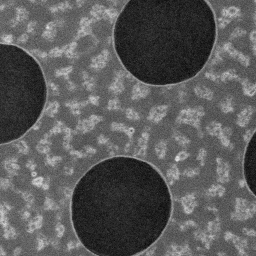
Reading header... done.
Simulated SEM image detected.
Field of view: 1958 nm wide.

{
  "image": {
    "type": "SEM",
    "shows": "holes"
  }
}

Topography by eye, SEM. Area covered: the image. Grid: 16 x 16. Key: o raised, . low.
oooooooo.....ooo
ooooooo......ooo
ooooooo......ooo
..ooooo......ooo
...ooooo....oooo
...ooooooooooooo
...ooooooooooooo
..oooooooooooooo
.ooooooooooooooo
ooooooooooooooo.
oooooo....ooooo.
ooooo.....ooooo.
oooo.......ooooo
oooo.......ooooo
ooooo.....oooooo
ooooo....ooooooo